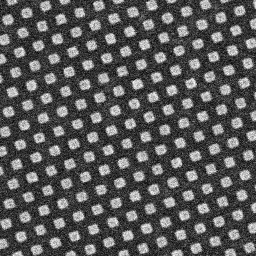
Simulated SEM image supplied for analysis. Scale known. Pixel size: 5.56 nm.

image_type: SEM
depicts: a regular array of raised bodies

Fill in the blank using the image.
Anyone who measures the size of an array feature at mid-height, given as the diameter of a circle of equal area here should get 0.0547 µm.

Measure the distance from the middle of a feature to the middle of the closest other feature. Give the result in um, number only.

0.111